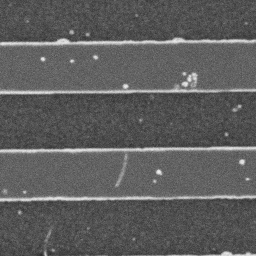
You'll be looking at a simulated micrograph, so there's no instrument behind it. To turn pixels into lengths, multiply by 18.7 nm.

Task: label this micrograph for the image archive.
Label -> lines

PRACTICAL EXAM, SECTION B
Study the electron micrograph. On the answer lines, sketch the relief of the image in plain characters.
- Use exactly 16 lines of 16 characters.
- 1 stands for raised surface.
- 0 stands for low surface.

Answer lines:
0000000000000000
0000000000000000
0000000000000000
1111111111111111
1111111111111111
1111111111111111
0000000000000000
0000000000000000
0000000000000000
1111111111111111
1111111111111111
1111111111111111
0000000000000000
0000000000000000
0000000000000000
0000000000000000